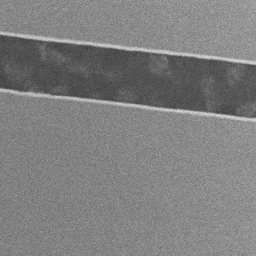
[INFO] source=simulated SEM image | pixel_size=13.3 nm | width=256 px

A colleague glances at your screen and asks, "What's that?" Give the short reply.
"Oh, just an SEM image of one or a few lines or trenches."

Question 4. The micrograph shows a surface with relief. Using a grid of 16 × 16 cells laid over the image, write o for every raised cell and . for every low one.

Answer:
oooooooooooooooo
oooooooooooooooo
....oooooooooooo
............oooo
................
................
oooooooo........
oooooooooooooooo
oooooooooooooooo
oooooooooooooooo
oooooooooooooooo
oooooooooooooooo
oooooooooooooooo
oooooooooooooooo
oooooooooooooooo
oooooooooooooooo